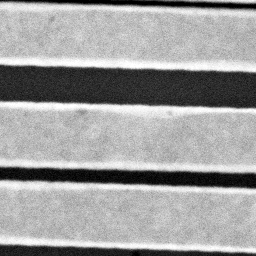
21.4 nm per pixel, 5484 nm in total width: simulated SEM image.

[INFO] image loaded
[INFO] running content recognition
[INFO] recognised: lines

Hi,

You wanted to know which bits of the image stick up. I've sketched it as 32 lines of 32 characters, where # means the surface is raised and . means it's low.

................................
################################
################################
################################
################################
################################
################################
################################
..............................##
................................
................................
................................
................................
################................
################################
################################
################################
################################
################################
################################
################################
................................
................................
########################........
################################
################################
################################
################################
################################
################################
........########################
................................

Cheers